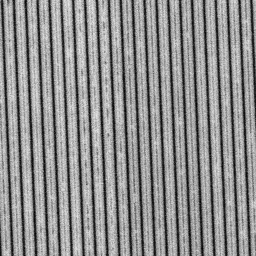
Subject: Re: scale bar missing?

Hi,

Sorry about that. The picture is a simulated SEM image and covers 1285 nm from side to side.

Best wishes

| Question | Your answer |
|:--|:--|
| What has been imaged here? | parallel lines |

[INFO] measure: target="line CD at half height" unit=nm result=21.3